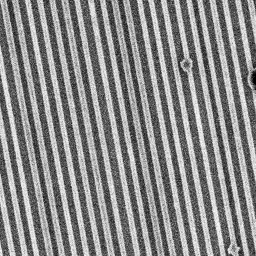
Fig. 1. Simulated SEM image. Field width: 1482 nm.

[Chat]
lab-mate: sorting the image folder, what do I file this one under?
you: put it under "parallel lines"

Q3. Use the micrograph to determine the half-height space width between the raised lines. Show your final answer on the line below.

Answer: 0.0406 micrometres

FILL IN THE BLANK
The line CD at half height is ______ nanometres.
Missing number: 25.7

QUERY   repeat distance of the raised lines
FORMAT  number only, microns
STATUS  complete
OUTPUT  0.0703